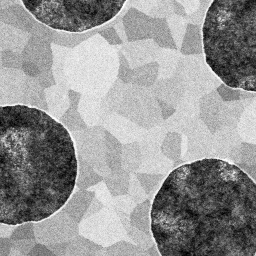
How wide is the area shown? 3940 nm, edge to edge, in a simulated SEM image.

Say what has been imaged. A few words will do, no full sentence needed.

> holes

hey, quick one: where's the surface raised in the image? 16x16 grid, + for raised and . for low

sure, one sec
++......+++++...
+++...+++++++...
+++++++++++++...
+++++++++++++...
+++++++++++++...
+++++++++++++++.
++++++++++++++++
....++++++++++++
....++++++++++++
.....+++++++++++
.....++++++....+
.....+++++......
....++++++......
...++++++.......
+++++++++.......
++++++++++......